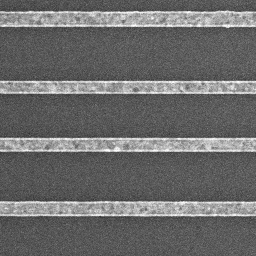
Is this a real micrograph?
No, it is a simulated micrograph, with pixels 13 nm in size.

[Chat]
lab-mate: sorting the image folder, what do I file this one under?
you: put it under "one or a few lines or trenches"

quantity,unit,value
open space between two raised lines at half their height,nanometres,668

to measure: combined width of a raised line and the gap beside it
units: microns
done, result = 0.823